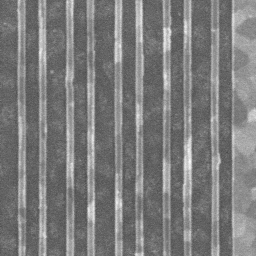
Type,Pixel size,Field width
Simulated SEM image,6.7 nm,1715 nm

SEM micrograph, parallel lines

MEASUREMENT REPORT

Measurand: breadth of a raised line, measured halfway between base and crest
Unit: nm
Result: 42.7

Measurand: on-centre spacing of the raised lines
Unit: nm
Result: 162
